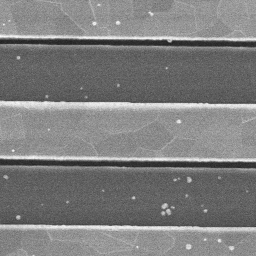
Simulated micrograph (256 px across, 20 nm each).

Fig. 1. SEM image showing lines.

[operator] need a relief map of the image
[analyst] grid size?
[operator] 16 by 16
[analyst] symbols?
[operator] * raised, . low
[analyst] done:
****************
****************
..............**
................
................
................
***********.....
****************
****************
****************
................
................
................
................
****************
****************